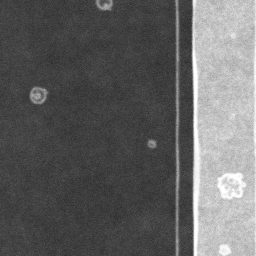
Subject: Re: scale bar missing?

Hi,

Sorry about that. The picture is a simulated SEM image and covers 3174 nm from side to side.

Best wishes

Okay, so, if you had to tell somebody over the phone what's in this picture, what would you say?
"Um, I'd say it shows wiring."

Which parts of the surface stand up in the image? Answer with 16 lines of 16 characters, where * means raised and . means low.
............****
............****
............****
............****
............****
............****
............****
............****
............****
............****
............****
............****
............****
............****
............****
............****